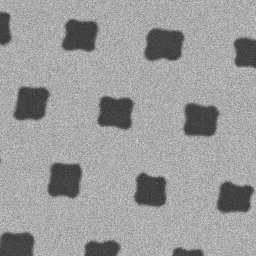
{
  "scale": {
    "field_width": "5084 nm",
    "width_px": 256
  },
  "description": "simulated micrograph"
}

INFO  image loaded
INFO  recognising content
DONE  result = a regular array of holes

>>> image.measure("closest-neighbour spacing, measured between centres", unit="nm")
1660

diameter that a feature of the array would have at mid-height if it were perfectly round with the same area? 0.686 µm